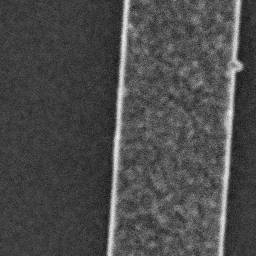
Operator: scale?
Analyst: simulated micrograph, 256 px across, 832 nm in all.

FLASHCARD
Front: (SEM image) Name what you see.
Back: one or a few lines or trenches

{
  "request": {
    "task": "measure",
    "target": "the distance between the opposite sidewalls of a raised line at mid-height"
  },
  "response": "367 nanometres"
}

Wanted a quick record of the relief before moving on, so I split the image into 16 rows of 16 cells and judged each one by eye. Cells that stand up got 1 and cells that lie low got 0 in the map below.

0000000011111110
0000000011111110
0000000011111110
0000000011111110
0000000011111110
0000000011111110
0000000111111110
0000000111111100
0000000111111100
0000000111111100
0000000111111100
0000000111111100
0000000111111100
0000000111111100
0000000111111100
0000000111111100